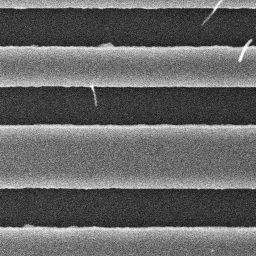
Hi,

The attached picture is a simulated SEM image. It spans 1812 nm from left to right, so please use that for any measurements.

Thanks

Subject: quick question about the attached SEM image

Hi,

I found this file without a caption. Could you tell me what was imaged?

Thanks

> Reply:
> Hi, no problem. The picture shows lines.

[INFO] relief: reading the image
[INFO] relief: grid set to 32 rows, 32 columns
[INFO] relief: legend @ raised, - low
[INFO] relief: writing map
@@@@@@@@@@@@@@@@@@@@@@@@@@@@@@@@
--------------------------------
--------------------------------
--------------------------------
--------------------------------
--------------------------------
@@@@@@@@@@@@@@@@@@@@@@@@@@@@@@@@
@@@@@@@@@@@@@@@@@@@@@@@@@@@@@@@@
@@@@@@@@@@@@@@@@@@@@@@@@@@@@@@@@
@@@@@@@@@@@@@@@@@@@@@@@@@@@@@@@@
@@@@@@@@@@@@@@@@@@@@@@@@@@@@@@@@
--------------------------------
--------------------------------
--------------------------------
--------------------------------
--------------------------------
@@@@@@@@@@@@@@@@@@@@@@@@@@@@@@@@
@@@@@@@@@@@@@@@@@@@@@@@@@@@@@@@@
@@@@@@@@@@@@@@@@@@@@@@@@@@@@@@@@
@@@@@@@@@@@@@@@@@@@@@@@@@@@@@@@@
@@@@@@@@@@@@@@@@@@@@@@@@@@@@@@@@
@@@@@@@@@@@@@@@@@@@@@@@@@@@@@@@@
@@@@@@@@@@@@@@@@@@@@@@@@@@@@@@@@
@@@--@@@@@@@@@@@@@@@@@@@@@@@@@@@
--------------------------------
--------------------------------
--------------------------------
--------------------------------
@@-@@@----@@@-----@@@@@@@@@@@--@
@@@@@@@@@@@@@@@@@@@@@@@@@@@@@@@@
@@@@@@@@@@@@@@@@@@@@@@@@@@@@@@@@
@@@@@@@@@@@@@@@@@@@@@@@@@@@@@@@@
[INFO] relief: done